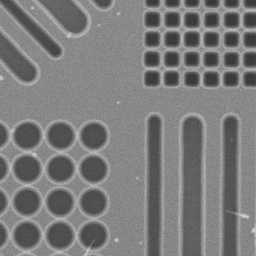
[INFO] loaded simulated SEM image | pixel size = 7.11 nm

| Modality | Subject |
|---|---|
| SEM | groups of lines, slits or small figures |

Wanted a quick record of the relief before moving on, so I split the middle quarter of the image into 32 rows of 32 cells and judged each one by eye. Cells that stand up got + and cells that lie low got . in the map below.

+++++++++++++++++++++..+++..+++.
++++++++++++++++++++++++++++++++
++++++++++++++++++++....+....+..
++++++++++++++++++++....+....+..
++++++++++++++++++++....+....+..
+++++++++++++++++++++..++++++++.
++++++++++++++++++++++++++++++++
++++++++++++++++++++++++++++++++
++++++++++++++++++++++++++++++++
++++++++++++++++++++++++++++++++
++++++++++++++++++++++++++++++++
++++++++++++++++++++++++++++++++
++++++++++++++++++++++++++++++++
+++++++++++++++++++++...++++++..
+++++++.+++++++++++++...++++++..
..+++.....+++++++++++...+++++...
..++.......++++++++++...+++++...
...+.......++++++++++...+++++...
...+.......++++++++++...+++++...
..++......+++++++++++...+++++...
..+++.....+++++++++++...+++++...
+++++++.+++++++++++++...+++++...
+++++++++++++++++++++...+++++...
.++++....++++++++++++...+++++...
..++......+++++++++++...+++++...
...+.......++++++++++...+++++...
...+.......++++++++++...+++++...
..++.......++++++++++...+++++...
..+++.....+++++++++++...+++++...
++++++...++++++++++++...+++++...
+++++++++++++++++++++...+++++...
.+++++...++++++++++++...+++++...